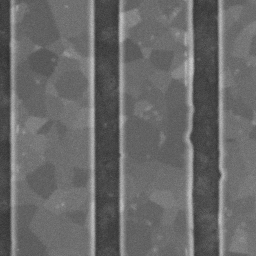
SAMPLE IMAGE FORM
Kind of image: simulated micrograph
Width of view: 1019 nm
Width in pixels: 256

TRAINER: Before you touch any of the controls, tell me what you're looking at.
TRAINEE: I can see one or a few lines or trenches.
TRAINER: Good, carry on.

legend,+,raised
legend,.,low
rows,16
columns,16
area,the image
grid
.+++++..++++..++
.+++++..++++..++
.+++++..++++..++
.+++++..++++..++
.+++++..++++..++
.+++++..++++..++
.+++++..++++..++
.+++++..++++..++
.+++++..++++..++
.+++++..++++..++
.+++++..++++..++
.+++++..++++..++
.+++++..++++..++
.+++++..++++..++
.+++++..++++..++
.+++++..++++..++